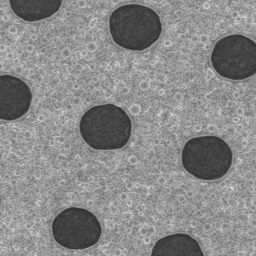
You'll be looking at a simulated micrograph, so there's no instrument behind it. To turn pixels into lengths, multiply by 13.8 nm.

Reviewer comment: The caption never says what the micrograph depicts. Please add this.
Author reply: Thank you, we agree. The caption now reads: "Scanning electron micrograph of holes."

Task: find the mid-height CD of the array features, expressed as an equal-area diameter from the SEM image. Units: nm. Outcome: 670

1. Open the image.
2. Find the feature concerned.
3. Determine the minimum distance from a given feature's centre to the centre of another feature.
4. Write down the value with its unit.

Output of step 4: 1.45 um